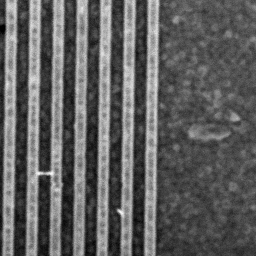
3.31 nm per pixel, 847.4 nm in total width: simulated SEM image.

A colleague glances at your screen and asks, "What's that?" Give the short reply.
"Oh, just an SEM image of parallel lines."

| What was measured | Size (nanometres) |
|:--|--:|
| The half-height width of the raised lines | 28.5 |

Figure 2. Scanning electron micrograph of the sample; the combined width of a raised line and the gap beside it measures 78.2 nm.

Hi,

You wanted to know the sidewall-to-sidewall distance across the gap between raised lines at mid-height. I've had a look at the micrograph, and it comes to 0.0504 um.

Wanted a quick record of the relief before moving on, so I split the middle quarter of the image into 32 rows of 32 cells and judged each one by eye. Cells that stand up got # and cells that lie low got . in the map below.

...##....##....##....##.........
...##....##....##....##.........
...##....##....##....##.........
...##....##....##....##.........
...##....##....##....##.........
...##....##....##....##.........
...##....##....##....##.........
...##....##....##....##.........
...##....##....##....##.........
...##....##....##....##.........
...##....##....##....##.........
...##....##....##....##.........
...##....##....##....##.........
...##....##....##....##.........
...##....##....##....##.........
...##....##....##....##.........
...##....##....##....##.........
...##....##....##....##.........
...##....##....##....##.........
...##....##....##....##.........
...##....##....##....##.........
...##....##....##....##.........
...##....##....##....##.........
...##....##....##....##.........
...##....##....##....##.........
...##....##....##....##.........
...##....##....##....##.........
...##....##....##....##.........
...##....##....##....##.........
...##....##....##....##.........
...##....##....##....##.........
...##....##....##....##.........